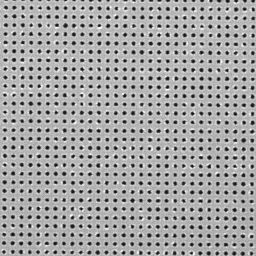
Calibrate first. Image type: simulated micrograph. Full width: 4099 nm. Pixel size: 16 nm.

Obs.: a regular array of holes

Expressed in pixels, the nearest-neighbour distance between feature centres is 8.3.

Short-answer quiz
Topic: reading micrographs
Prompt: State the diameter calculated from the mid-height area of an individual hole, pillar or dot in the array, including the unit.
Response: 67.6 nanometers